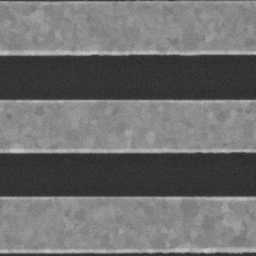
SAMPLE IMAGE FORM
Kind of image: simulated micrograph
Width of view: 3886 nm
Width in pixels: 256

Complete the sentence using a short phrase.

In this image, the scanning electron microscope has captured lines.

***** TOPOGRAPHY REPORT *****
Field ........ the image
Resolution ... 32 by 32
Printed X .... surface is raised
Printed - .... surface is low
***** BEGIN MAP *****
XXXXXXXXXXXXXXXXXXXXXXXXXXXXXXXX
XXXXXXXXXXXXXXXXXXXXXXXXXXXXXXXX
XXXXXXXXXXXXXXXXXXXXXXXXXXXXXXXX
XXXXXXXXXXXXXXXXXXXXXXXXXXXXXXXX
XXXXXXXXXXXXXXXXXXXXXXXXXXXXXXXX
XXXXXXXXXXXXXXXXXXXXXXXXXXXXXXXX
XXXXXXXXXXXXXXXXXXXXXXXXXXXXXXXX
--------------------------------
--------------------------------
--------------------------------
--------------------------------
--------------------------------
--------------------------------
XXXXXXXXXXXXXXXXXXXXXXXXXXXXXXXX
XXXXXXXXXXXXXXXXXXXXXXXXXXXXXXXX
XXXXXXXXXXXXXXXXXXXXXXXXXXXXXXXX
XXXXXXXXXXXXXXXXXXXXXXXXXXXXXXXX
XXXXXXXXXXXXXXXXXXXXXXXXXXXXXXXX
XXXXXXXXXXXXXXXXXXXXXXXXXXXXXXXX
--------------------------------
--------------------------------
--------------------------------
--------------------------------
--------------------------------
--------------------------------
XXXXXXXXXXXXXXXXXXXXXXXXXXXXXXXX
XXXXXXXXXXXXXXXXXXXXXXXXXXXXXXXX
XXXXXXXXXXXXXXXXXXXXXXXXXXXXXXXX
XXXXXXXXXXXXXXXXXXXXXXXXXXXXXXXX
XXXXXXXXXXXXXXXXXXXXXXXXXXXXXXXX
XXXXXXXXXXXXXXXXXXXXXXXXXXXXXXXX
XXXXXXXXXXX-XXXX---------X------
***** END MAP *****